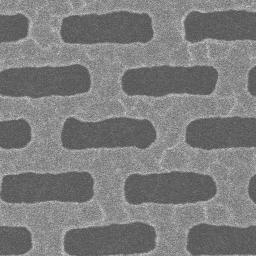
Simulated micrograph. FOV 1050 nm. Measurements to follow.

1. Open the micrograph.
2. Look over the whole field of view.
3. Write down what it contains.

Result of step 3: holes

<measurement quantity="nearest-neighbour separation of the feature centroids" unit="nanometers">334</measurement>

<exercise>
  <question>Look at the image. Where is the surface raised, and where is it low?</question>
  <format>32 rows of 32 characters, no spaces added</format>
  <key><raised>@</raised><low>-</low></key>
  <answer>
@@@@@@@@@@@@@@@@@@@@@@@@@@@@@@@@
@@@@@@@@@@@@@@---@@@@@@@-@@-----
----@@@@-----------@@@@---------
----@@@@-----------@@@@---------
---@@@@@-----------@@@@---------
@@@@@@@@@---@@@@@@@@@@@@@@@@@@@@
@@@@@@@@@@@@@@@@@@@@@@@@@@@@@@@@
@@@@@@@@@@@@@@@@@@@@@@@@@@@@@@@@
@----------@@@@@@----------@@@@@
-----------@@@@------------@@@@-
-----------@@@@------------@@@@-
-----------@@@@@-----------@@@@-
@@@@@@@@@@@@@@@@@@@@@@@@@@@@@@@@
@@@@@@@@@@@@@@@@@@@@@@@@@@@@@@@@
@@@@@@@@@@@@@@@@@@@@@@@@@@@@@@@@
----@@@@-----------@@@@@--------
----@@@@-----------@@@@---------
----@@@@-----------@@@@---------
---@@@@@----@@@@@-@@@@@@----@@@@
@@@@@@@@@@@@@@@@@@@@@@@@@@@@@@@@
@@@@@@@@@@@@@@@@@@@@@@@@@@@@@@@@
@@@@@@@@@--@@@@@@@@@@--@@@@@@@@@
------------@@@@-----------@@@@-
------------@@@------------@@@@-
------------@@@@-----------@@@@-
@@@@@@@@@@@@@@@@--@@@@-@@@@@@@@@
@@@@@@@@@@@@@@@@@@@@@@@@@@@@@@@@
@@@@@@@@@@@@@@@@@@@@@@@@@@@@@@@@
---@@@@@@@@--------@@@@@--------
----@@@@------------@@@---------
----@@@@-----------@@@@---------
---@@@@@-----------@@@@@--------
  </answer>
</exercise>